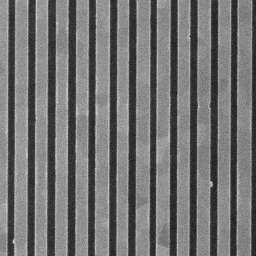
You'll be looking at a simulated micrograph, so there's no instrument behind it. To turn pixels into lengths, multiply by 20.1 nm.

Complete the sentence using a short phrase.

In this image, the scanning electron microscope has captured parallel lines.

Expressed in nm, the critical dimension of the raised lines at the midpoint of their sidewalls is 249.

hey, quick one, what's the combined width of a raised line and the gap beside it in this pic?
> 408 nm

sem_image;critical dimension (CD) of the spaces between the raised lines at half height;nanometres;159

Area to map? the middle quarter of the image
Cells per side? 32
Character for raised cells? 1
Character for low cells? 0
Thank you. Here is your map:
10011100111001110011100111000110
10011100111001110011100111000110
10011100111001110011100111000110
10011100111001110011100111000110
10011100111001110011100111000110
10011100111001110011100111000110
10011100111001110011100111001110
10011100111001110011100111000110
10011100111001110011100111000110
10011100111001110011100111001110
10011100111001110011100111101110
10011100111001110011100111001110
10011100111001110011100111001110
10011100111001110011100111000110
10011100111001110011100111000110
10011100111001110011100111001110
10011100111001110011100111001110
10011100111001110011100110000110
10011100111001110011100110001110
10011100111001110011100111001110
10011100111001110011100111001110
10011100111001110011100111001110
10011100111001110011100111000110
10011100111001110011100111000110
10011100111001110011100111000110
10011100111001110011100111000110
10011100111001110011100111000110
10011100111001110011100111000110
10011100111001110011100111000110
10011100111001110011100111001110
10011100111001110011100111001110
10011100111001110011100111000110